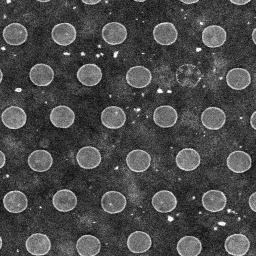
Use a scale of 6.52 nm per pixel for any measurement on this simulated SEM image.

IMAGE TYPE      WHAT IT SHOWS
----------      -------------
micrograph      a regular array of raised bodies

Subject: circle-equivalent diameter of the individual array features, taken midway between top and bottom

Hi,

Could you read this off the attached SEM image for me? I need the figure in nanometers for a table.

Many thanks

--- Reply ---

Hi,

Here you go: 149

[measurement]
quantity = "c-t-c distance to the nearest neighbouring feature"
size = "310 nanometers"